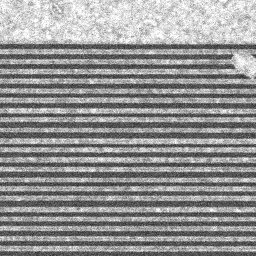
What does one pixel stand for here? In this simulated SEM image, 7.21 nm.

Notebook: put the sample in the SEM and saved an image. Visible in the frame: parallel lines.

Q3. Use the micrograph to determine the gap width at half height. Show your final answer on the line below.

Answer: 0.0424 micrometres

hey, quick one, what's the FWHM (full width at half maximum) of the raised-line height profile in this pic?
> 0.0297 micrometres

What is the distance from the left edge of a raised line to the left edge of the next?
71.1 nanometers